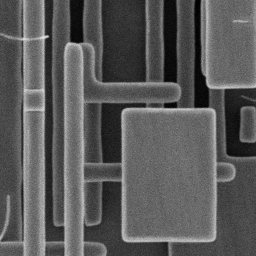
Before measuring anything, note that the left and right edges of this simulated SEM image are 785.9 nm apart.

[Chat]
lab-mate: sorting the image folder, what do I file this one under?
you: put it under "wiring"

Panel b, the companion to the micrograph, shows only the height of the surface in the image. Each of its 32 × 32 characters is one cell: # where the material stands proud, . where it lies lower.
...##....................#######
...##....................#######
...##....................#######
...##....................#######
...###...................#######
...##....##..............#######
...##...####.............#######
...##...####.............#######
...##...####.............#######
...##...####..............######
...##...##############....######
...###..###############.........
...###..##############..........
...###..##......................
...###..##.....############.....
...##...##.....############.....
...##...##.....############.....
...##...##.....############.....
...##...##.....############.....
...###..##.....############.....
...###..#####################...
...###..#####################...
...###..#####################...
...###..##.....############.....
...###..##.....############.....
...###..##.....############.....
...###..##.....############.....
...###..##.....############.....
...###..##.....############.....
...###..##.....############.....
#############...................
#############...................